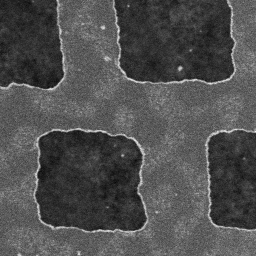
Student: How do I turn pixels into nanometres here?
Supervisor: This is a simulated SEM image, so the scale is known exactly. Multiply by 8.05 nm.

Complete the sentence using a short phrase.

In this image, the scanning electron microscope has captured holes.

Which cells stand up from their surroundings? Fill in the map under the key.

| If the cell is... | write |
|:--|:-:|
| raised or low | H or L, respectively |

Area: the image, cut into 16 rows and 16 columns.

LLLLHHHLLLLLLLHH
LLLLHHHLLLLLLLHH
LLLLHHHLLLLLLLLH
LLLLHHHLLLLLLLLH
LLLLHHHHLLLLLLLH
HHLHHHHHHHHHHHHH
HHHHHHHHHHHHHHHH
HHHHHHHHHHHHHHHH
HHHLLLLLHHHHHLLL
HHLLLLLLLHHHHLLL
HHLLLLLLLHHHHLLL
HHLLLLLLLHHHHLLL
HHLLLLLLLHHHHLLL
HHLLLLLLLHHHHLLL
HHHHHHHHHHHHHHHH
HHHHHHHHHHHHHHHH